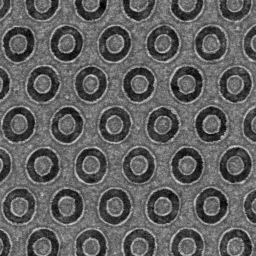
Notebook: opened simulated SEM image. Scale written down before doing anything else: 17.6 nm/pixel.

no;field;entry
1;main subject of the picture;a regular array of ring-shaped grooves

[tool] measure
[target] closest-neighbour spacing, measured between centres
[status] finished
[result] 826 nm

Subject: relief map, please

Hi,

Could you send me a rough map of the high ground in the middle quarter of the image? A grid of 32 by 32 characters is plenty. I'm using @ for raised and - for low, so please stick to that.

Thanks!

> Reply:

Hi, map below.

@@@@@@-@@@@@@@@@@@@@@@@@@@@@@@@@
@@@@-----@@@@@@@-----@@@@@@@----
@@@-------@@@@@-------@@@@@-----
@@@--@@@---@@@@--@@@---@@@@--@@@
@@@--@@@@--@@@@--@@@@--@@@@-@@@@
@@@--@@@@--@@@@--@@@@-@@@@---@@@
@@@--@@@--@@@@@--@@@---@@@@--@@@
@@@-------@@@@@@------@@@@@-----
@@@@-----@@@@@@@-----@@@@@@@----
@@@@@@-@@@@@@@@@@---@@@@@@@@@---
@@@@@@@@@@@@@@@@@@@@@@@@@@@@@@@@
---@@@@@@@@----@@@@@@@@----@@@@@
----@@@@@-------@@@@@@------@@@@
@@---@@@@---@@---@@@@---@@--@@@@
@@@--@@@@--@@@@--@@@@--@@@@--@@@
@@@--@@@@--@@@@--@@@@--@@@@--@@@
@@---@@@@--@@@--@@@@@--@@@---@@@
@---@@@@@-------@@@@@-------@@@@
---@@@@@@@-----@@@@@@@-----@@@@@
---@@@@@@@@---@@@@@@@@@---@@@@@@
@@@@@@@@@@@@@@@@@@@@@@@@@@@@@@@@
@@@@@----@@@@@@@@----@@@@@@@@---
@@@@------@@@@@@------@@@@@@----
@@@--@@@--@@@@@--@@@--@@@@@---@@
@@@--@@@@--@@@@--@@@@--@@@@--@@@
@@@--@@@@--@@@@--@@@@--@@@@--@@@
@@@--@@@@--@@@@--@@@---@@@@--@@@
@@@-------@@@@@---@---@@@@@---@-
@@@@------@@@@@@------@@@@@@----
@@@@@----@@@@@@@@---@@@@@@@@@---
@@@@@@@@@@@@@@@@@@@@@@@@@@@@@@@@
--@@@@@@@@@----@@@@@@@@@---@@@@@